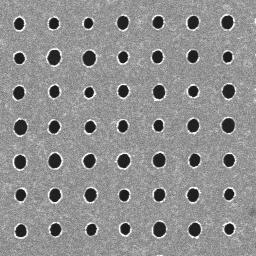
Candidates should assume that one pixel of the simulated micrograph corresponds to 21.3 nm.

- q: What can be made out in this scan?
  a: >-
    a regular array of holes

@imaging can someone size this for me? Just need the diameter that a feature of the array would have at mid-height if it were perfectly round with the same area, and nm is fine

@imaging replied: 265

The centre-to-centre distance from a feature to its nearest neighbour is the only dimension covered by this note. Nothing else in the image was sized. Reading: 723 nanometers